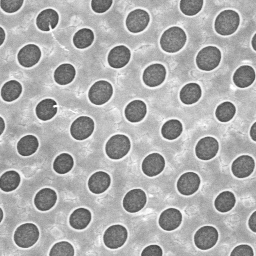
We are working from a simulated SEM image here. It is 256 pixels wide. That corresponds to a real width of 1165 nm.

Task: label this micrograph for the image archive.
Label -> a regular array of holes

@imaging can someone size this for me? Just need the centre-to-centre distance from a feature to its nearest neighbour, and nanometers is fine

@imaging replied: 181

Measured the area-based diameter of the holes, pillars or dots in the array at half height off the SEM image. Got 107 nanometres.